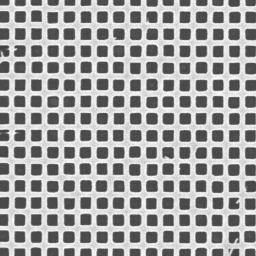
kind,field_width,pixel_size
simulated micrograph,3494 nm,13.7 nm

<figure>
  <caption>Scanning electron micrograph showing a regular array of holes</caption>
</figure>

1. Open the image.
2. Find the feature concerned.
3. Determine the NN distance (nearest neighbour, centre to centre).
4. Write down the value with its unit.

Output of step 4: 220 nanometres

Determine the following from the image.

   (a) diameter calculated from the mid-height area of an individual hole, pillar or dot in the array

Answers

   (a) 177 nanometres